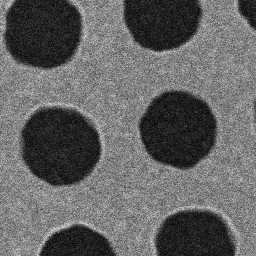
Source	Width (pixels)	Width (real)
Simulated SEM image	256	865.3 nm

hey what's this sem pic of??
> holes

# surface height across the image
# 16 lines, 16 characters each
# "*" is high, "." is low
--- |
*....***.....**.
.....***....****
.....***....****
*....***********
****************
****************
*********....***
**...****....***
*.....***....***
*.....***....***
**....*****.****
***..***********
****************
***********...**
****..****....**
***....***.....*